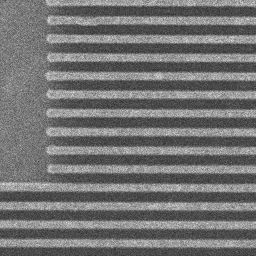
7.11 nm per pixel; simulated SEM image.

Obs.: parallel lines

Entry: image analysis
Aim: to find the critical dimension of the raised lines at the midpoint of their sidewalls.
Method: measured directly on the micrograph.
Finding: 7.88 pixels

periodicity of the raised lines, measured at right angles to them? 0.132 um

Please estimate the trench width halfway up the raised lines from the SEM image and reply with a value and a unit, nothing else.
76.5 nm